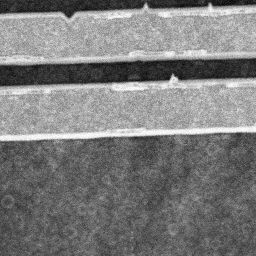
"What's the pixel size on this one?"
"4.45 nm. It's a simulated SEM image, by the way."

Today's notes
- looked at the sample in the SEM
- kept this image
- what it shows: one or a few lines or trenches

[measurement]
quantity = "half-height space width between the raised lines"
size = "112 nm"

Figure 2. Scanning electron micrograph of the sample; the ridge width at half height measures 214 nm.